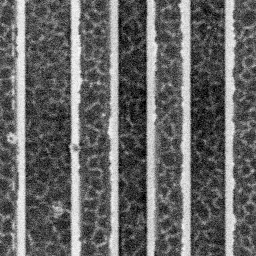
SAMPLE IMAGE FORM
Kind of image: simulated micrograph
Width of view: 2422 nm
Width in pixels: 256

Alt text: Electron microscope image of one or a few lines or trenches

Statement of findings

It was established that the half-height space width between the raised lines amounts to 42.5 pixels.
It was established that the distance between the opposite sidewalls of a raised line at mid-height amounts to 360 nanometres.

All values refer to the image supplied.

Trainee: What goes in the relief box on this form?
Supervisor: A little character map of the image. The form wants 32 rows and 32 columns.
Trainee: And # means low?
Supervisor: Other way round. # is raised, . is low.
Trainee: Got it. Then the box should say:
###......#####.....####......###
###......#####.....####......###
###......#####.....####......###
###......#####.....####......###
###......#####.....####......###
###......#####.....####......###
###......#####.....####......###
###......#####.....####......###
###......#####.....####......###
###......#####.....####......###
###......#####.....####......###
###......#####.....####......###
###......#####.....####......###
###......#####.....####......###
###......#####.....####......###
###......#####.....####......###
###......#####.....####......###
###......#####.....####......###
###......#####.....####......###
###......#####.....####......###
###......#####.....####......###
###......#####.....####......###
###......#####.....####......###
###......#####.....####......###
###......#####.....####......###
###......#####.....####......###
###......#####.....####......###
###......#####.....####......###
###......#####.....####......###
###......#####.....####......###
###......#####.....####......###
###......#####.....####......###